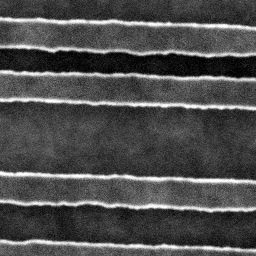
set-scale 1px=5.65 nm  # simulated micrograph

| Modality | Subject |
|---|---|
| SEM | lines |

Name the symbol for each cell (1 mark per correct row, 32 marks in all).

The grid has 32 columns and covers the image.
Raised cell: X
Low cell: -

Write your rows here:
--------------------------------
--------------------------------
XXXXXX--------------------------
XXXXXXXXXXXXXXXXXXXXXXXXXXXXXXX-
XXXXXXXXXXXXXXXXXXXXXXXXXXXXXXXX
XXXXXXXXXXXXXXXXXXXXXXXXXXXXXXXX
------------XX--XXXXX-XXXXXXXXXX
--------------------------------
--------------------------------
XXXXXXXXXXXXXXXXXXXX------------
XXXXXXXXXXXXXXXXXXXXXXXXXXXXXXXX
XXXXXXXXXXXXXXXXXXXXXXXXXXXXXXXX
XXXXXXXXXXXXXXXXXXXXXXXXXXXXXXXX
-------------------------X-XXXXX
--------------------------------
--------------------------------
--------------------------------
--------------------------------
--------------------------------
--------------------------------
--------------------------------
--------------------------------
XXXXXXXXXXXXXXXXXXXXXXXX--------
XXXXXXXXXXXXXXXXXXXXXXXXXXXXXXXX
XXXXXXXXXXXXXXXXXXXXXXXXXXXXXXXX
---X-XXXXX--XXXXXXXXXXXXXXXXXXXX
--------------------------------
--------------------------------
--------------------------------
--------------------------------
XXXXXXXXXXX---------------------
XXXXXXXXXXXXXXXXXXXXXXXXXXXXXXXX